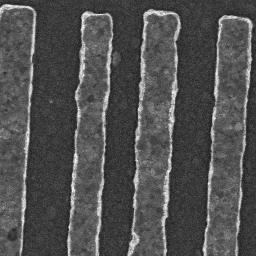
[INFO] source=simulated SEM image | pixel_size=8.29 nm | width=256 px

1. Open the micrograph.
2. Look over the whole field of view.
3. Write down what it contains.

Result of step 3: one or a few lines or trenches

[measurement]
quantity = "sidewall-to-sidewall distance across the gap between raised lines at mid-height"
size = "339 nm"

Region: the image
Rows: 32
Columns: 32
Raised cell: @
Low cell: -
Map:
--------------------------------
@@@@----------------------------
@@@@------@@@@----@@@@------@@@-
@@@@------@@@@----@@@@-----@@@@-
@@@@------@@@@----@@@@-----@@@@-
@@@@------@@@@----@@@@-----@@@@-
@@@@------@@@@----@@@@-----@@@@-
@@@@------@@@@----@@@@-----@@@@-
@@@@------@@@@----@@@@-----@@@@-
@@@@------@@@@----@@@@-----@@@@-
@@@@------@@@@----@@@@-----@@@@-
@@@@------@@@@----@@@@-----@@@@-
@@@@------@@@----@@@@@-----@@@@-
@@@@------@@@----@@@@@-----@@@@-
@@@@------@@@----@@@@@-----@@@@-
@@@@------@@@----@@@@@-----@@@@-
@@@@-----@@@@----@@@@------@@@@-
@@@------@@@@----@@@@------@@@@-
@@@------@@@@----@@@@-----@@@@@-
@@@------@@@@----@@@@------@@@--
@@@------@@@@----@@@@-----@@@@--
@@@------@@@@----@@@@-----@@@@--
@@@------@@@@----@@@@-----@@@@--
@@@------@@@@----@@@@-----@@@@--
@@@------@@@-----@@@@-----@@@@--
@@@------@@@@----@@@@-----@@@@--
@@@------@@@@----@@@@-----@@@@--
@@@------@@@@----@@@@-----@@@@--
@@@------@@@-----@@@@-----@@@@--
@@@------@@@-----@@@@-----@@@@--
@@@------@@@-----@@@@-----@@@@--
@@@------@@@----@@@@@-----@@@@--